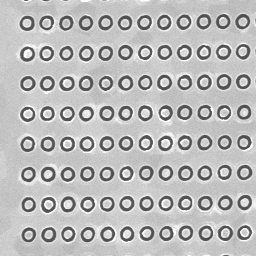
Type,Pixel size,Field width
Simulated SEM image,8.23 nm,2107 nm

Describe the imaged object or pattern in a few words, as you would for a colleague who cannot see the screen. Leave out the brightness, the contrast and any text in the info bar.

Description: a regular array of ring-shaped grooves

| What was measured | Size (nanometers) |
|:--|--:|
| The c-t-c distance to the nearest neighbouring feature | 159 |